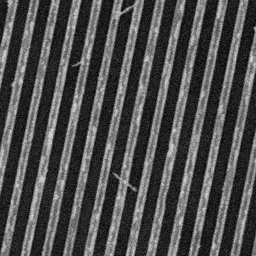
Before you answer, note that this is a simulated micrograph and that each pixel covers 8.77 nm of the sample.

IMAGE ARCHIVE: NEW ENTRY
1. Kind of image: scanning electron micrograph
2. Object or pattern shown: parallel lines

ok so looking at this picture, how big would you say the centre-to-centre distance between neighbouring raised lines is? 0.18 um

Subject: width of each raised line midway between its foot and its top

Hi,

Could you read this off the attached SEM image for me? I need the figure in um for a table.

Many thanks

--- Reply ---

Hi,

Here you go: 0.0666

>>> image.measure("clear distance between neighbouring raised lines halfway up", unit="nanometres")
116